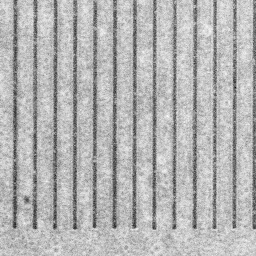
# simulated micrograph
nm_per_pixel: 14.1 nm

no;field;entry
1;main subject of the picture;parallel lines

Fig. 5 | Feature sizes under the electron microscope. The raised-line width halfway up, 15.1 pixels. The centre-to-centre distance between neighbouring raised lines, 281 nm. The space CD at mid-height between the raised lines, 66.8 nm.